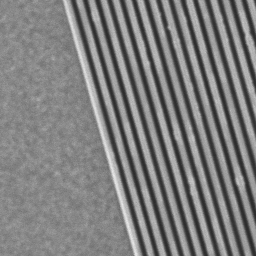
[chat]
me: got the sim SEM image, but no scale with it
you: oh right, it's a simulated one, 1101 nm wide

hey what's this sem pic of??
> parallel lines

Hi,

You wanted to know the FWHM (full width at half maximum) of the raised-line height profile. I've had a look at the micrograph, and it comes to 30 nm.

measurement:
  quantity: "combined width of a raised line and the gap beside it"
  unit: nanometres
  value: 50.5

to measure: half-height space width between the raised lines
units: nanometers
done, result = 21.7